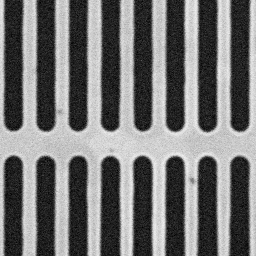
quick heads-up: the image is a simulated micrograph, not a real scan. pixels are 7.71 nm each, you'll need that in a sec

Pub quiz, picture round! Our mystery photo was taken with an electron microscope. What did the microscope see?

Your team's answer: groups of lines, slits or small figures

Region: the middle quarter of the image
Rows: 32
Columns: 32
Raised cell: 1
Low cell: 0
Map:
10000011100000111000001110000001
10000011100000111000001110000001
10000011100000111000001110000001
10000011100000111000001110000001
10000011100000111000001110000001
10000011100000111000001110000001
10000011100000111000001110000001
10000011100000111000001110000001
10000011100000111000001110000001
10000011100000111000001110000001
10000011100000111000001110000001
10000011100000111000001110000001
10000011100000111000001110000001
10000011100000111000001110000001
10000011100000111000001110000001
10000011100000111000001110000011
11000111110001111100011111000011
11111111111111111111111111111111
11111111111111111111111111111111
11111111111111111111111111111111
11111111111111111111111111111111
11111111111111111111111111111111
11111111111111111111111111111111
11000011110001111100001111000011
10000011100000111000001110000011
10000011100000111000000110000001
10000011100000111000000110000001
10000011100000111000000110000001
10000011100000111000000110000001
10000011100000111000000110000001
10000011100000111000000110000001
10000011100000111000000110000001